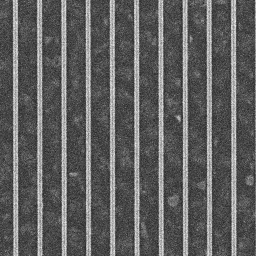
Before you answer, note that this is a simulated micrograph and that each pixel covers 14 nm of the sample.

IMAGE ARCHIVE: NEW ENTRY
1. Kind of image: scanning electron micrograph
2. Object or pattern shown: parallel lines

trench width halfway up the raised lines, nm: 296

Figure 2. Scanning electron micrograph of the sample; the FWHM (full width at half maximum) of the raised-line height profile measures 3.5 px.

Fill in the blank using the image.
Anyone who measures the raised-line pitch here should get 339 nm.